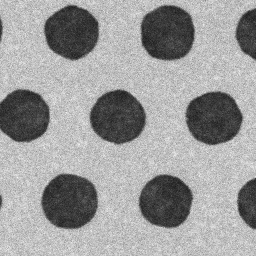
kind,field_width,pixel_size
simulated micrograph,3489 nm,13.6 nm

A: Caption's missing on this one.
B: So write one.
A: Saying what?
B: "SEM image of holes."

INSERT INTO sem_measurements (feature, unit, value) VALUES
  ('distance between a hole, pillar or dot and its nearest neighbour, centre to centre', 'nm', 1310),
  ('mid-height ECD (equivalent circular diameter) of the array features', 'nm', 748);